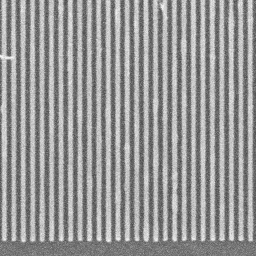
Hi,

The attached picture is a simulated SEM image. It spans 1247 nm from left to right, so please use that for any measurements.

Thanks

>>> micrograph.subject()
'parallel lines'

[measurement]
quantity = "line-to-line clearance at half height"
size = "26.8 nanometers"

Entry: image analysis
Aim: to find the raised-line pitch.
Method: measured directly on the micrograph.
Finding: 0.0461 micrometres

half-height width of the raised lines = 0.0176 um